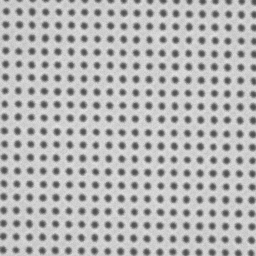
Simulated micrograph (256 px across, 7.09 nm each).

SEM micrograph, a regular array of holes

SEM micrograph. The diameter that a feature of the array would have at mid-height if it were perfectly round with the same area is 56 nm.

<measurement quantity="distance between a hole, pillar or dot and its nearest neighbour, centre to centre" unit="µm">0.0903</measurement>